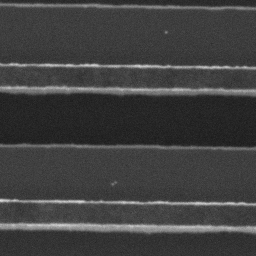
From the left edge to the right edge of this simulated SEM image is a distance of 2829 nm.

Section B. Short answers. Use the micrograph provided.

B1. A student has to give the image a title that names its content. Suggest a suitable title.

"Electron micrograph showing lines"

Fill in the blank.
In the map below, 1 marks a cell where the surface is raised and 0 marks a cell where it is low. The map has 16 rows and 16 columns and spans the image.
1111111111100000
1111111111111111
1111111111111111
1111111111111111
1111111111111111
1111111111111111
0000000000000000
0000000000000000
0000000000000000
1111111111111111
1111111111111111
1111111111111111
1111111111111111
1111111111111111
0000000000000000
0000000000000000